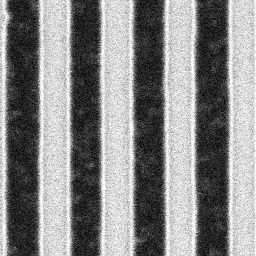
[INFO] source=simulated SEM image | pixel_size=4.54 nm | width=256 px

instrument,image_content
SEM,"one or a few lines or trenches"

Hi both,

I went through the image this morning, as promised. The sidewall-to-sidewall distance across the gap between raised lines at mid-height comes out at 112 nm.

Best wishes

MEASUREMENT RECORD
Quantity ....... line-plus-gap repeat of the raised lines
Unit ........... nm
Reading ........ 286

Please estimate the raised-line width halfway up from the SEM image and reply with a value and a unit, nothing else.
38.3 pixels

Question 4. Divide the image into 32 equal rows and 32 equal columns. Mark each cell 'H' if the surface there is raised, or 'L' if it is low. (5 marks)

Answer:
HHHHHLLLHHHHHLLLHHHHHLLLHHHHHLLL
HHHHHLLLHHHHHLLLHHHHHLLLHHHHHLLL
LHHHHLLLHHHHHLLLHHHHHLLLHHHHHLLL
HHHHHLLLHHHHHLLLHHHHHLLLHHHHHLLL
HHHHHLLLHHHHHLLLHHHHHLLLHHHHHLLL
HHHHHLLLHHHHHLLLHHHHHLLLHHHHHLLL
HHHHHLLLHHHHHLLLHHHHHLLLHHHHHLLL
HHHHHLLLHHHHHLLLHHHHHLLLHHHHHLLL
HHHHHLLLHHHHHLLLHHHHHLLLHHHHHLLL
HHHHHLLLHHHHHLLLHHHHHLLLHHHHHLLL
HHHHHLLLHHHHHLLLHHHHHLLLHHHHHLLL
HHHHHLLLHHHHHLLLHHHHHLLLHHHHHLLL
HHHHHLLLHHHHHLLLHHHHHLLLHHHHHLLL
HHHHHLLLHHHHHLLLHHHHHLLLHHHHHLLL
HHHHHLLLHHHHHLLLHHHHHLLLHHHHHLLL
HHHHHLLLHHHHHLLLHHHHHLLLHHHHHLLL
HHHHHLLLHHHHHLLLHHHHHLLLHHHHHLLL
HHHHHLLLHHHHHLLLHHHHHLLLHHHHHLLL
HHHHHLLLHHHHHLLLHHHHHLLLHHHHHLLL
HHHHHLLLHHHHHLLLHHHHHLLLHHHHHLLL
HHHHHLLLHHHHHLLLHHHHHLLLHHHHHLLL
HHHHHLLLHHHHHLLLHHHHHLLLHHHHHLLL
HHHHHLLLHHHHHLLLHHHHHLLLHHHHHLLL
HHHHHLLLHHHHHLLLHHHHHLLLHHHHHLLL
HHHHHLLLHHHHHLLLHHHHHLLLHHHHHLLL
HHHHHLLLHHHHHLLLHHHHHLLLHHHHHLLL
HHHHHLLLHHHHHLLLHHHHHLLLHHHHHLLL
HHHHHLLLHHHHHLLLHHHHHLLLHHHHHLLL
LHHHHLLLLHHHHLLLHHHHHLLLHHHHHLLL
LHHHHLLLLHHHHLLLHHHHHLLLHHHHHLLL
LHHHHLLLLHHHHLLLHHHHHLLLHHHHHLLL
LHHHHLLLLHHHHLLLHHHHHLLLHHHHHLLL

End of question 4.